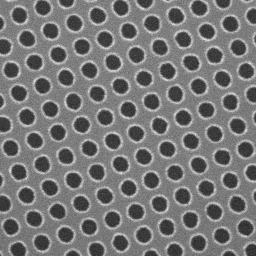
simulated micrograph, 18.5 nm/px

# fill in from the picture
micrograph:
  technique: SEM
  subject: a regular array of holes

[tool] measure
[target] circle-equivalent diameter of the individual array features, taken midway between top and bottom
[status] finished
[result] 0.306 um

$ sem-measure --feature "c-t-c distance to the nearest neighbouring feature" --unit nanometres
452